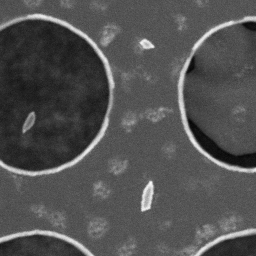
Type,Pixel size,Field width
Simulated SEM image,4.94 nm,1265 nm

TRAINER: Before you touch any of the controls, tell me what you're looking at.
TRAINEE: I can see holes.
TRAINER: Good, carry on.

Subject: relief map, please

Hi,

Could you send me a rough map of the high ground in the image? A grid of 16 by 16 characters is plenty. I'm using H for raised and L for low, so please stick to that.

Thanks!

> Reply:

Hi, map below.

HHHHHHHHHHHHHHHH
HLLLHHHHHHHHHHHL
LLLLLHHHHHHHHLLL
LLLLLLHHHHHHLLLL
LLLLLLLHHHHHLLLL
LLLLLLLHHHHLLLLL
LLLLLLLHHHHHLLHH
LLLLLLLHHHHHLLHH
LLLLLLHHHHHHLLLL
LLLLLHHHHHHHHLLL
HLLHHHHHHHHHHHHL
HHHHHHHHHHHHHHHH
HHHHHHHHHHHHHHHH
HHHHHHHHHHHHHHHH
HHHHHHHHHHHHHHHH
LLLLLHHHHHHHHLLL